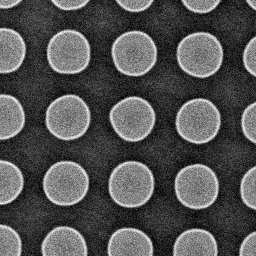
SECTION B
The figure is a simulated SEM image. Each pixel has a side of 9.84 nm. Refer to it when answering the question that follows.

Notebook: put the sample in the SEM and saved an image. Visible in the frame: an array of small figures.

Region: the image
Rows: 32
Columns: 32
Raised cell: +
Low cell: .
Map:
++.....++++....++++....++++....+
.........................+......
................................
................................
++.....+++.....+++......+++.....
+++...+++++...+++++...+++++....+
+++...+++++...+++++...++++++...+
+++...+++++...+++++...++++++..++
++.....++++....++++....++++....+
........................++......
................................
................................
++.....+++.....+++......++......
+++...+++++...+++++....++++....+
+++...+++++...+++++...+++++...++
+++...+++++...+++++...+++++...++
++....+++++....++++...+++++....+
................+......+++.....+
................................
................................
+......++......+++..............
++....+++++...+++++....++++....+
+++..++++++...+++++...+++++...++
+++...+++++...+++++...+++++...++
++....++++....+++++...+++++...++
.......++......+++.....+++.....+
................................
................................
+......++.......................
++....++++....++++.....+++.....+
+++..++++++...+++++...+++++...++
+++..++++++...+++++...+++++...++